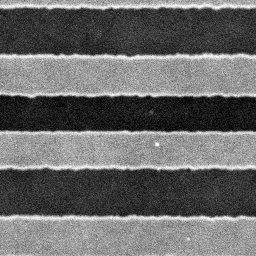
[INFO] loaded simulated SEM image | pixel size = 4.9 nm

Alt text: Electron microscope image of lines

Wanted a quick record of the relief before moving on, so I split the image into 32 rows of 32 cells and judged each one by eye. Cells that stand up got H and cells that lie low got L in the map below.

HHHHHHHHHHHHHHHHHHHHHHHHHHHHHHHH
LLLLLLLLLLLLLLLLLLLLLLLLLLLLLLLL
LLLLLLLLLLLLLLLLLLLLLLLLLLLLLLLL
LLLLLLLLLLLLLLLLLLLLLLLLLLLLLLLL
LLLLLLLLLLLLLLLLLLLLLLLLLLLLLLLL
LLLLLLLLLLLLLLLLLLLLLLLLLLLLLLLL
LLLLLLLLLLLLLLLLLLLLLLLLLLLLLLLL
HHHHHHHHHHHHHHHHHHHHHHHHHHHHHHHH
HHHHHHHHHHHHHHHHHHHHHHHHHHHHHHHH
HHHHHHHHHHHHHHHHHHHHHHHHHHHHHHHH
HHHHHHHHHHHHHHHHHHHHHHHHHHHHHHHH
HHHHHHHHHHHHHHHHHHHHHHHHHHHHHHHH
LLLLLLLLLLLLLLLLLLLLLLLLLLLLLLLL
LLLLLLLLLLLLLLLLLLLLLLLLLLLLLLLL
LLLLLLLLLLLLLLLLLLLLLLLLLLLLLLLL
LLLLLLLLLLLLLLLLLLLLLLLLLLLLLLLL
HHHHHHHHHHHHHHHHHHHHHHHHHHHHHHHH
HHHHHHHHHHHHHHHHHHHHHHHHHHHHHHHH
HHHHHHHHHHHHHHHHHHHHHHHHHHHHHHHH
HHHHHHHHHHHHHHHHHHHHHHHHHHHHHHHH
HHHHHHHHHHHHHHHHHHHHHHHHHHHHHHHH
LLLLLLLLLLLLLLLLLLLLLLLLLLLLLLLL
LLLLLLLLLLLLLLLLLLLLLLLLLLLLLLLL
LLLLLLLLLLLLLLLLLLLLLLLLLLLLLLLL
LLLLLLLLLLLLLLLLLLLLLLLLLLLLLLLL
LLLLLLLLLLLLLLLLLLLLLLLLLLLLLLLL
LLLLLLLLLLLLLLLLLLLLLLLLLLLLLLLL
HHHHHHHHHHHHHHHHHHHHHHHHHHHHHHHH
HHHHHHHHHHHHHHHHHHHHHHHHHHHHHHHH
HHHHHHHHHHHHHHHHHHHHHHHHHHHHHHHH
HHHHHHHHHHHHHHHHHHHHHHHHHHHHHHHH
HHHHHHHHHHHHHHHHHHHHHHHHHHHHHHHH